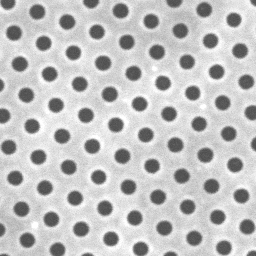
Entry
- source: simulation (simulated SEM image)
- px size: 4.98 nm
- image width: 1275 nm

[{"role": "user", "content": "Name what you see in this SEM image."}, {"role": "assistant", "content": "a regular array of holes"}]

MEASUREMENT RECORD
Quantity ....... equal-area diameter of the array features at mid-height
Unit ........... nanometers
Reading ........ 82.3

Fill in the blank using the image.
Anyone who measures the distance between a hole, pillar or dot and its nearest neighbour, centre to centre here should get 156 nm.